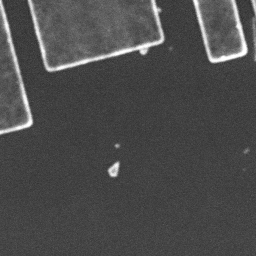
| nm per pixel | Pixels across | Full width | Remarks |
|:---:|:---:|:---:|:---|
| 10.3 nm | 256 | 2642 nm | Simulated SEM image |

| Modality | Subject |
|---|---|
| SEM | groups of lines, slits or small figures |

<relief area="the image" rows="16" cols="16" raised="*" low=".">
..********..***.
..********...**.
*.********...**.
*..****......**.
*...............
*...............
**..............
**..............
................
................
................
................
................
................
................
................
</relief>